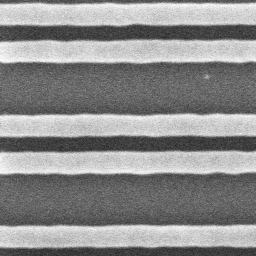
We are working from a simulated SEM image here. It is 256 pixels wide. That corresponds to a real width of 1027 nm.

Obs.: wiring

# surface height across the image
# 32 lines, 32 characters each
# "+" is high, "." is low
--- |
................................
++++++++++++++++++++++++++++++++
++++++++++++++++++++++++++++++++
................................
................................
++++++++++++++++++++++++++++++++
++++++++++++++++++++++++++++++++
++++++++++++++++++++++++++++++++
................................
................................
................................
................................
................................
................................
+++++++++++++++++.++++++++++++++
++++++++++++++++++++++++++++++++
++++++++++++++++++++++++++++++++
................................
................................
++++++++++++++++++++++++++++++++
++++++++++++++++++++++++++++++++
+++++++++++++++++++++++++++++++.
................................
................................
................................
................................
................................
................................
++++++++++++++++++++++++++++++++
++++++++++++++++++++++++++++++++
++++++++++++++++++++++++++++++++
................................